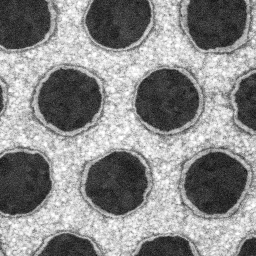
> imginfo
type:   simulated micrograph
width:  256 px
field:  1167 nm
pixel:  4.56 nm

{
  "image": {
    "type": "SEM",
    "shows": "raised bodies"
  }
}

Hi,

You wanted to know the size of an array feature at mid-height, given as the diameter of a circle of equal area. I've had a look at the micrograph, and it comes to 311 nanometres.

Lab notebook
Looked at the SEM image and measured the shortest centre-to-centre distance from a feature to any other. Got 434 nanometres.